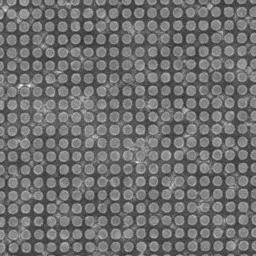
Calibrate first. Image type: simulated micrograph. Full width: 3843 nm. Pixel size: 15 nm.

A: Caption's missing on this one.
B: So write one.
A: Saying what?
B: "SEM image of a regular array of raised bodies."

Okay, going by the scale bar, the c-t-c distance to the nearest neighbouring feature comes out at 190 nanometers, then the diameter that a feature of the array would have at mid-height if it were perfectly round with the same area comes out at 142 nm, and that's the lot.